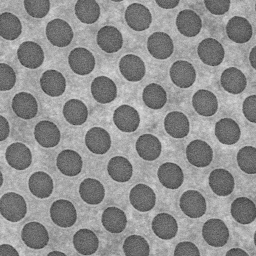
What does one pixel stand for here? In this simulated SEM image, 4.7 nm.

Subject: a regular array of holes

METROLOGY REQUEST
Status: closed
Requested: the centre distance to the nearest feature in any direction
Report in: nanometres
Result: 169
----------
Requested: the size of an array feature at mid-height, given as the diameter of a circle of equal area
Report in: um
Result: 0.129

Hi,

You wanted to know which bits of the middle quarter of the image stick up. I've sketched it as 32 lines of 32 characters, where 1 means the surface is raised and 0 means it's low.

10000000111110000000111111100000
11000001111111000000011111000000
11100011111111000000111111000000
11111111000111100000111111100000
01111110000001111011111111100000
01111110000001111111000011110000
11111110000001111111000001111111
11111110000001111110000000111111
11111110000001111110000000111111
00000111000011111111000000111111
00000011111111000111100001111111
00000011111110000011111111111111
00000011111100000001111111000011
00000011111100000001111110000001
10000111111100000001111110000001
11111111111110000001111110000000
11111100000111000011111110000001
11111000000111111111001111000001
11111000000011111100000011100011
11111000000011111100000011111111
11111100000011111100000011111110
00111100000111111100000001111100
00001111001111111100000011111100
00001111111100001110000011111110
00000111111000000111111110011110
00000111111000000111111100000111
00001111111000000111111000000011
00001111111000000111111000000011
11111101111100000111111100000011
11110000011110011111111100000011
11110000001111111000011110000111
11110000001111111000001111111110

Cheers